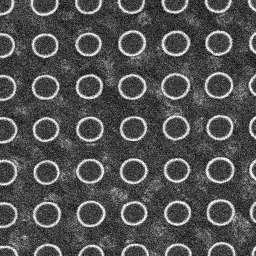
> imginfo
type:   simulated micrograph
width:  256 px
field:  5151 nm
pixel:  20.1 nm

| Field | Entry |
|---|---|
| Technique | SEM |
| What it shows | a regular array of raised bodies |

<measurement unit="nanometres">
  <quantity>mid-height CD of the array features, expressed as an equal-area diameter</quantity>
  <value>493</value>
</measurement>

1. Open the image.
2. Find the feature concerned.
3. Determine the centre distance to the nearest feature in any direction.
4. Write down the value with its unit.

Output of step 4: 847 nm